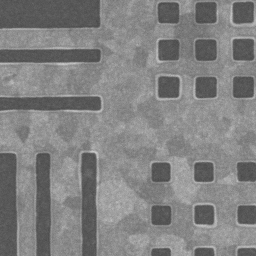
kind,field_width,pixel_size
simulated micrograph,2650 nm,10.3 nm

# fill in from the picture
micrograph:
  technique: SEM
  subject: groups of lines, slits or small figures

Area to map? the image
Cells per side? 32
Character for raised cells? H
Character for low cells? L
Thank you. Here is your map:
LLLLLLLLLLLLLHHHHHHHLLHHHLLHHLLL
LLLLLLLLLLLLLHHHHHHHLLLHLLLHHLLL
LLLLLLLLLLLLLHHHHHHHLLHHLLLHHLLL
LLLLLLLLLLLLHHHHHHHHHHHHHHHHHHHH
HHHHHHHHHHHHHHHHHHHHHHHHHHHHHHHH
HHHHHHHHHHHHHHHHHHHHLLHHLLLHHLLL
LLLLLLLLLLLLLHHHHHHHLLLHLLLHHLLL
LLLLLLLLLLLLHHHHHHHHLLHHHLLHHHLH
HHHHHHHHHHHHHHHHHHHHHHHHHHHHHHHH
HHHHHHHHHHHHHHHHHHHHLLHHHLHHHHLH
HHHHHHHHHHHHHHHHHHHHLLLHLLLHHLLL
HHHHHHHHHHHHHHHHHHHHLLLHLLLHHLLL
LLLLLLLLLLLLLHHHHHHHHHHHHHHHHHHH
LLLLLLLLLLLLLHHHHHHHHHHHHHHHHHHH
HHHHHHHHHHHHHHHHHHHHHHHHHHHHHHHH
HHHHHHHHHHHHHHHHHHHHHHHHHHHHHHHH
HHHHHHHHHHHHHHHHHHHHHHHHHHHHHHHH
HHHHHHHHHHHHHHHHHHHHHHHHHHHHHHHH
HHHHHHHHHHHHHHHHHHHHHHHHHHHHHHHH
LLHHHLHHHHLLHHHHHHHHHHHHHHHHHHHH
LLHHLLHHHHLLHHHHHHHLLHHHLLLHHHLL
LLHHLLHHHHLLHHHHHHHLLHHHLLLHHHLL
LLHHLLHHHHLLHHHHHHHLLHHHLLLHHHLL
LLHHHLHHHHLLHHHHHHHHHHHHHHHHHHHH
LLHHLLHHHHLLHHHHHHHHHHHHHHHHHHHH
LLHHLLHHHHLLHHHHHHHHHHHHHHHHHHHH
LLHHLLHHHHLLHHHHHHHLLHHHLLLHHHLL
LLHHLLHHHHLLHHHHHHHLLHHHLLLHHHLL
LLHHLLHHHHLLHHHHHHHHHHHHHHHHHHHH
LLHHLLHHHHLLHHHHHHHHHHHHHHHHHHHH
LLHHLLHHHHLLHHHHHHHHHHHHHHHHHHHH
LLHHLLHHHHLLHHHHHHHLLHHHLLLHHHLL